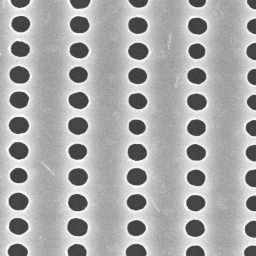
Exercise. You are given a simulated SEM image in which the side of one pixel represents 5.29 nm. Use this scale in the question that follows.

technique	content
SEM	a regular array of holes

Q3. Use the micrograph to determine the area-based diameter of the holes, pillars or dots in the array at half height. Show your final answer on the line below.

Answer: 0.0969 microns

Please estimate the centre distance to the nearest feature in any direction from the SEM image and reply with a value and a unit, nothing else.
133 nm